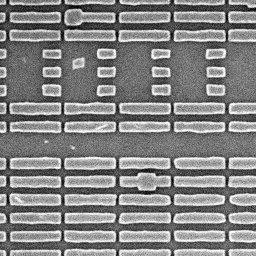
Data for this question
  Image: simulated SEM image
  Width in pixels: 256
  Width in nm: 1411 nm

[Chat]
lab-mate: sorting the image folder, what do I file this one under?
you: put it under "wiring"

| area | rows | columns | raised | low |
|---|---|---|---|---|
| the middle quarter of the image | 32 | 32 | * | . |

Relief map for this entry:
................................
.........****.........****......
.........****.........****......
................................
................................
........................**......
........*****.........****......
........****..........****......
................................
................................
*************.*************.****
*************.*************.****
................................
................................
................................
*************.************..****
*************.************..****
................................
................................
................................
................................
................................
................................
.....*****......................
*************.************..****
*************.************..****
................................
...................****.........
*************.*************.****
*************.*************.****
************..************..****
................................